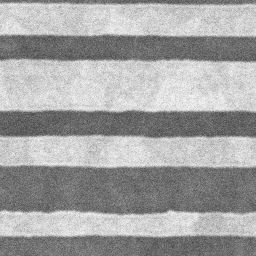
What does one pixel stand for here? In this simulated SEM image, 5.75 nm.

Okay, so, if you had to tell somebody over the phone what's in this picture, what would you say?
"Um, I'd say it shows one or a few lines or trenches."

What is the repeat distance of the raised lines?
392 nanometers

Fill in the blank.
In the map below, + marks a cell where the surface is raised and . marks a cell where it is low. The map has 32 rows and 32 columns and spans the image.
................................
++++++++++++++++++++++++++++++++
++++++++++++++++++++++++++++++++
++++++++++++++++++++++++++++++++
................................
................................
................................
................................
++++++++++++++++++++++++++++++++
++++++++++++++++++++++++++++++++
++++++++++++++++++++++++++++++++
++++++++++++++++++++++++++++++++
++++++++++++++++++++++++++++++++
++++++++++++++++++++++++++++++++
................................
................................
................................
++++++++++++++++++++++++++++++++
++++++++++++++++++++++++++++++++
++++++++++++++++++++++++++++++++
++......++++++++++++++++++++++++
................................
................................
................................
................................
................................
.....................+..........
++++++++++++++++++++++++++++++++
++++++++++++++++++++++++++++++++
................................
................................
................................